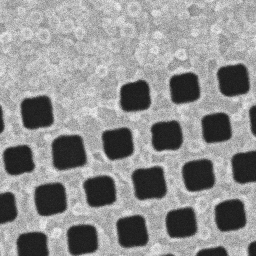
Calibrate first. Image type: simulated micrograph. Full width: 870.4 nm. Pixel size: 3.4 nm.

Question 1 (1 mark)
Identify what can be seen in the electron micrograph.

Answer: a regular array of holes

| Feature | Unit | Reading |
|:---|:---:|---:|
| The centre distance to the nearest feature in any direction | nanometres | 169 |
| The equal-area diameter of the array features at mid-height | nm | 112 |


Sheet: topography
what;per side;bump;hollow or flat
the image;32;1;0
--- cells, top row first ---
11111111111111111111111111111111
11111111111111111111111111111111
11111111111111111111111111111111
11111111111111111111111111111111
11111111111111111111111111111111
11111111111111111111111111111111
11111111111111111111111111111111
11111111111111111111111111111111
11111111111111111111111111110001
11111111111111111111110001100001
11111111111111110011100001100001
11111111111111100001100001110001
11100011111111100001110011111111
11100001111111100001111111111110
11100001111111111111111111001110
11100011111111111110001110000110
11111111111110001110000110000110
11111110001110000110000111000111
10001100000110000110001111111111
00001110000110001111111111111000
10001110000111111111111000011000
10011111111111111000111000011000
11111111111000111000011000011000
11111000110000111000011000111111
00110000111000011000111111111111
00110000111000111111111111100011
00111000111111111111100011100001
00111111111111100011100011100001
11111111100011100011100001100011
11100011000011100011100011111111
11000011000011100011111111111110
11000011100011111111111110001110